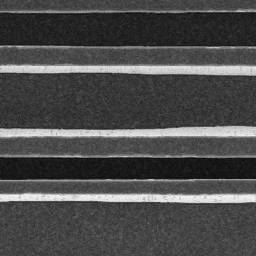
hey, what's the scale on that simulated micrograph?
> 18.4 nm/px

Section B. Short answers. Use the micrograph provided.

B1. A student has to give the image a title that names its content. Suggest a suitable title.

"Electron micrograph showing lines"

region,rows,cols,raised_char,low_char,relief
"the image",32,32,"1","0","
11111111111111111111111111111111
00000000000000000000000000000000
00000000000000000000000000000000
00000000000000000000000000000000
00000000000000000000000000000000
00000000000000000000000000000000
11111111111111111111111111111111
11111111111111111111111111111111
00001111110000011111111111111111
00000000000000000000000000000000
00000000000000000000000000000000
00000000000000000000000000000000
00000000000000000000000000000000
00000000000000000000000000000000
00000000000000000000000000000000
00000000000000000000000000000000
00000000000000000000000000000000
11111111111111111111111111111111
11111111111111111111111111111111
00000011111111111111111111111111
00000000000000000000000000000000
00000000000000000000000000000000
00000000000001101011100111111111
11111111111111111111111111111111
11111111111111111111111111111111
00000000000000000000000000000000
00000000000000000000000000000000
00000000000000000000000000000000
00000000000000000000000000000000
00000000000000000000000000000000
00000000000000000000000000000000
00000000000000000000000000000000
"